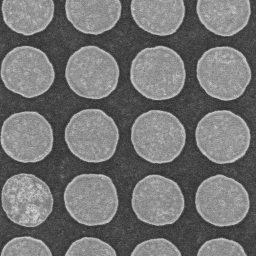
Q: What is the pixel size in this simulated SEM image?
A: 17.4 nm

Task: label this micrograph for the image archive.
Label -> a regular array of raised bodies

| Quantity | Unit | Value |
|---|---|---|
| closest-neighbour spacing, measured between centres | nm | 1110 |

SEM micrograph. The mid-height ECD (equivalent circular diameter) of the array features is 926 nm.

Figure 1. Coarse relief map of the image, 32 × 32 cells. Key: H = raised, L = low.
HHHHHHHLHHHHHHHLHHHHHHHLLHHHHHHL
HHHHHHHLHHHHHHHLLHHHHHHLLHHHHHHL
LHHHHHLLLHHHHHHLLHHHHHHLLHHHHHHL
LHHHHHLLLLHHHHLLLLHHHHLLLLHHHHLL
LLLLLLLLLLLLLLLLLLLLLLLLLLLLLLLL
LLLLLLLLLLLLLLLLLLLLLLLLLLLLLLLL
LHHHHLLLLLHHHLLLLLHHHHLLLLHHHHLL
HHHHHHLLLHHHHHLLLHHHHHHLLHHHHHHL
HHHHHHHLHHHHHHHLHHHHHHHLLHHHHHHL
HHHHHHHLHHHHHHHLHHHHHHHLLHHHHHHL
LHHHHHLLLHHHHHHLLHHHHHHLLHHHHHHL
LLHHHHLLLHHHHHLLLHHHHHLLLLHHHHLL
LLLLLLLLLLLLLLLLLLLLLLLLLLLLLLLL
LLLLLLLLLLLLLLLLLLLLLLLLLLLLLLLL
LLHHHLLLLHHHHHLLLLHHHHLLLLHHHHLL
HHHHHHLLLHHHHHLLLHHHHHHLLHHHHHHL
HHHHHHLLHHHHHHHLHHHHHHHLLHHHHHHL
HHHHHHHLHHHHHHHLHHHHHHHLLHHHHHHL
HHHHHHLLLHHHHHLLLHHHHHHLLHHHHHHL
LHHHHHLLLLHHHHLLLLHHHHLLLLHHHHLL
LLLLLLLLLLLLLLLLLLLLLLLLLLLLLLLL
LLLLLLLLLLLLLLLLLLLLLLLLLLLLLLLL
LLLLLLLLLHHHHHLLLLHHHLLLLLHHHLLL
LLLLLLLLHHHHHHLLLHHHHHLLLHHHHHLL
LLLLLLLLHHHHHHHLLHHHHHHLHHHHHHHL
LLLLLLLLHHHHHHHLLHHHHHHLHHHHHHHL
LLLLLLLLLHHHHHHLLHHHHHHLLHHHHHHL
LLLLLLLLLLHHHHLLLLHHHHLLLLHHHHLL
LLLLLLLLLLLLLLLLLLLLLLLLLLLLLLLL
LLLLLLLLLLLLLLLLLLLLLLLLLLLLLLLL
LHHHHHLLLHHHHLLLLLHHHHLLLHHHHHLL
HHHHHHLLHHHHHHLLLHHHHHLLLHHHHHHL